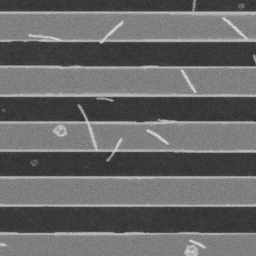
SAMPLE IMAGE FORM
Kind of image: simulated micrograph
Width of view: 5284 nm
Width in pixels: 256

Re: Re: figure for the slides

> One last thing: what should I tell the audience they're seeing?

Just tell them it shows lines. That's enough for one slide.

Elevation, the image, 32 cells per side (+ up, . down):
................................
................................
++++++++++++++++++++++++++++++++
++++++++++++++++++++++++++++++++
++++++++++++++++++++++++++++++++
................................
................................
................................
++++++++++++++++++++++++++++++++
++++++++++++++++++++++++++++++++
++++++++++++++++++++++++++++++++
++++++++++++++++++++++++++++++++
................................
................................
................................
++++++++++++++++++++++++++++++++
++++++++++++++++++++++++++++++++
++++++++++++++++++++++++++++++++
++++++++++++++++++++++++++++++++
................................
................................
................................
++++++++++++++++++++++++++++++++
++++++++++++++++++++++++++++++++
++++++++++++++++++++++++++++++++
++++++++++++++++++++++++++++++++
................................
................................
................................
++++++++++++++++++++++++++++++++
++++++++++++++++++++++++++++++++
++++++++++++++++++++++++++++++++